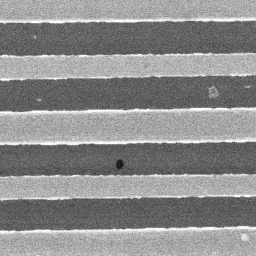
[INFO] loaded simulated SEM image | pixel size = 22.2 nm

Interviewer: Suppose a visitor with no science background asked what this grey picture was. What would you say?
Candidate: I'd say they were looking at lines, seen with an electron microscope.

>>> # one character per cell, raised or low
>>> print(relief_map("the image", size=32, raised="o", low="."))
oooooooooooooooooooooooooooooooo
oooooooooooooooooooooooooooooooo
ooooooooooooooooooooooooooooo...
................................
................................
................................
................................
oooooooooooooooooooooooooooooooo
oooooooooooooooooooooooooooooooo
ooooooooooooooooooo.............
................................
................................
................................
................................
oooooooooooooooooooooooooooooooo
oooooooooooooooooooooooooooooooo
oooooooooooooooooooooooooooooooo
oooooooooooooooooooooooooooooooo
................................
................................
................................
................................
oooooooooooooooooooooooooooooooo
oooooooooooooooooooooooooooooooo
oooooooooooooooooooooooooo......
................................
................................
................................
.............................ooo
oooooooooooooooooooooooooooooooo
oooooooooooooooooooooooooooooooo
oooooooooooooooooooooooooooooooo